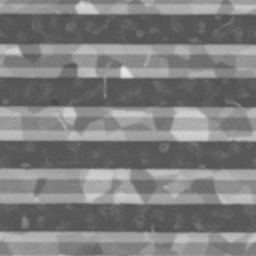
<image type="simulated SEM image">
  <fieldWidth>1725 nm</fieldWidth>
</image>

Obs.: one or a few lines or trenches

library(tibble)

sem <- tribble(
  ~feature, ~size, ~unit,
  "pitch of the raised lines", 423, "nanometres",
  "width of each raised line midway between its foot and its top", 22.5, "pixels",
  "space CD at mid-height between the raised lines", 0.271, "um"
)